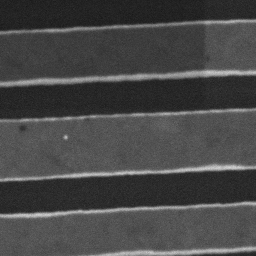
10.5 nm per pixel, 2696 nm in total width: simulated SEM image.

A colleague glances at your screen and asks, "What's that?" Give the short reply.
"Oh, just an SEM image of lines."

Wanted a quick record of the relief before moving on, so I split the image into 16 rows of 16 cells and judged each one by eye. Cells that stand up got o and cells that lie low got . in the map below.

................
..........oooooo
oooooooooooooooo
oooooooooooooooo
oooooooooooooooo
................
................
.ooooooooooooooo
oooooooooooooooo
oooooooooooooooo
oooooooooooooooo
................
................
oooooooooooooooo
oooooooooooooooo
oooooooooooooooo